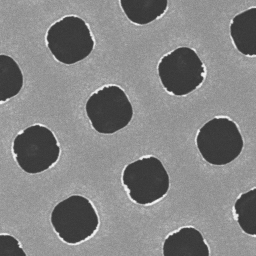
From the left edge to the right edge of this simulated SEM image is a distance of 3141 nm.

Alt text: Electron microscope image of holes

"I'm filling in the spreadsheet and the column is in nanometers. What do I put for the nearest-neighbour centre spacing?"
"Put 979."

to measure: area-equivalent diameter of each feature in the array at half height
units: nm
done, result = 566